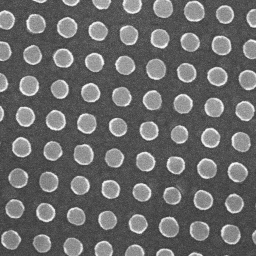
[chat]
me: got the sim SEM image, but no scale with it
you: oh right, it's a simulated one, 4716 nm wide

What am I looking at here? a regular array of raised bodies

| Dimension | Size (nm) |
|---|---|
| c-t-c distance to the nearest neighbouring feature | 566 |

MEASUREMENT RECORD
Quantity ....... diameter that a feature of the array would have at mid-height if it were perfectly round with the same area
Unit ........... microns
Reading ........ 0.344